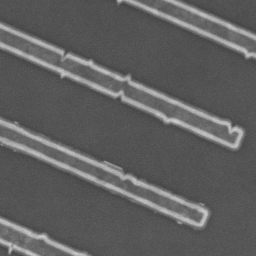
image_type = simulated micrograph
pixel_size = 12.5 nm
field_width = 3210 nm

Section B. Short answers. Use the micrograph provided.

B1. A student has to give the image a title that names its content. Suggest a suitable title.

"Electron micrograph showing one or a few lines or trenches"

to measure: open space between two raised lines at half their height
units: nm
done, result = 909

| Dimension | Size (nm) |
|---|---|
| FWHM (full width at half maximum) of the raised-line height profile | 212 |